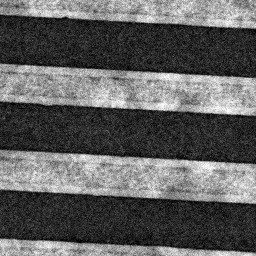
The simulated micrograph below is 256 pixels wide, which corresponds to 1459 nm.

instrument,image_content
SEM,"one or a few lines or trenches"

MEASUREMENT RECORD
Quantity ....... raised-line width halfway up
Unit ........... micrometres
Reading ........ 0.176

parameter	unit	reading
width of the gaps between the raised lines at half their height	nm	324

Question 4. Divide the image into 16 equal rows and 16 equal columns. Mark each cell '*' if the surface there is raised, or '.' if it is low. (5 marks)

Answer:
****************
...............*
................
................
****............
****************
.......*********
................
................
................
****************
****************
................
................
................
*******.........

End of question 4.